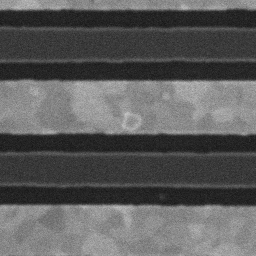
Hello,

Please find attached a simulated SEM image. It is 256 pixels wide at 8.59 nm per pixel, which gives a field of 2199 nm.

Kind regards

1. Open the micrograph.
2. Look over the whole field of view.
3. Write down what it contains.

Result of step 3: lines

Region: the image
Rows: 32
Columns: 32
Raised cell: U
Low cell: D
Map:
UUUUUUUUUUUUUUUUUUUUUUUUUUUUUUUU
DDDDDDDDDDDDDDDDDDDDDDDDDDDDDDDD
DDDDDDDDDDDDDDDDDDDDDDDDDDDDDDDD
UDDDDDDDDDDDDDDDDDDDDDDDDDDDDDDD
UUUUUUUUUUUUUUUUUUUUUUUUUUUUUUUU
UUUUUUUUUUUUUUUUUUUUUUUUUUUUUUUU
UUUUUUUUUUUUUUUUUUUUUUUUUUUUUUUU
UUUUUUUUUUUUUUUUUUUUUDDUUUUUUUUU
DDDDDDDDDDDDDDDDDDDDDDDDDDDDDDDD
DDDDDDDDDDDDDDDDDDDDDDDDDDDDDDDD
UUUUUUUUUUUUUUUUUUUUUUUUUUUUUUUU
UUUUUUUUUUUUUUUUUUUUUUUUUUUUUUUU
UUUUUUUUUUUUUUUUUUUUUUUUUUUUUUUU
UUUUUUUUUUUUUUUUUUUUUUUUUUUUUUUU
UUUUUUUUUUUUUUUUUUUUUUUUUUUUUUUU
UUUUUUUUUUUUUUUUUUUUUUUUUUUUUUUU
UUUUUUUUUUUUUUUUUUUUUUUUUUUUUUUU
DDDDDDDDDDDDDDDDDDDDDDDDDDDDDDDD
DDDDDDDDDDDDDDDDDDDDDDDDDDDDDDDD
UUUUUUUUUUUUUUUUUUUUUUUUUUUUUUUU
UUUUUUUUUUUUUUUUUUUUUUUUUUUUUUUU
UUUUUUUUUUUUUUUUUUUUUUUUUUUUUUUU
UUUUUUUUUUUUUUUUUUUUUUUUUUUUUUUU
DDDDDDDDDDDDDDDDDDDDDDDDDDDDDDDD
DDDDDDDDDDDDDDDDDDDDDDDDDDDDDDDD
DDDDDDDDDDDDDDDDDDDDDDDDDDDDDDDD
UUUUUUUUUUUUUUUUUUUUUUUUUUUUUUUU
UUUUUUUUUUUUUUUUUUUUUUUUUUUUUUUU
UUUUUUUUUUUUUUUUUUUUUUUUUUUUUUUU
UUUUUUUUUUUUUUUUUUUUUUUUUUUUUUUU
UUUUUUUUUUUUUUUUUUUUUUUUUUUUUUUU
UUUUUUUUUUUUUUUUUUUUUUUUUUUUUUUU